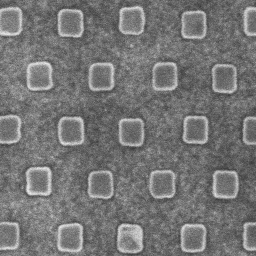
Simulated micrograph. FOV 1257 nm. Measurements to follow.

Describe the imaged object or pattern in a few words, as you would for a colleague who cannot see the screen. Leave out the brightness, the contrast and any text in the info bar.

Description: a regular array of raised bodies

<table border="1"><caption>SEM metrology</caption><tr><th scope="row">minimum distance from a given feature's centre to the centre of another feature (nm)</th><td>296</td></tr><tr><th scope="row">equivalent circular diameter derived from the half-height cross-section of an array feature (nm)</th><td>138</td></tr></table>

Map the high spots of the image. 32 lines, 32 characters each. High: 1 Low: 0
00000000000000000000000000000000
11100000110000011100000010000001
11100001110000011100000111000001
11100001110000011100000111000001
00000000110000000000000110000000
00000000000000000000000000000000
00000000000000000000000000000000
00000000000000000000000000000000
00001100000111000001110000011000
00001100000111000001110000011100
00001110000111000001110000011100
00000000000000000000000000001000
00000000000000000000000000000000
00000000000000000000000000000000
01000000000000000000000000000000
11100001110000011100000111000011
11000001110000011100000111000011
11000001110000011100000111000011
00000000000000000000000000000000
00000000000000000000000000000000
00000000000000000000000000000000
00011100000011000001100000011000
00011100000111000001110000011100
00011100000111000001110000011100
00000000000111000001100000011000
00000000000000000000000000000000
00000000000000000000000000000000
00000000000000000000000000000000
11000000110000011000000111000001
11000001110000011100000111000001
11000001110000011100000111000001
00000000000000000000000110000000